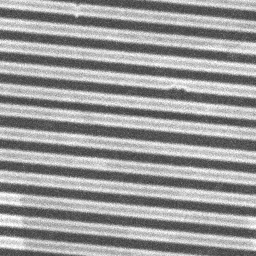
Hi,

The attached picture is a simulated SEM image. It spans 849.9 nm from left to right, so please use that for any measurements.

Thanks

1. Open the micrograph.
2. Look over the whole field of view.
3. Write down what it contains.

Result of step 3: parallel lines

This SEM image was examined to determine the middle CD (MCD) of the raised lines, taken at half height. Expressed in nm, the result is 28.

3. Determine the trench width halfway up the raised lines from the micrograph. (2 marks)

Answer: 42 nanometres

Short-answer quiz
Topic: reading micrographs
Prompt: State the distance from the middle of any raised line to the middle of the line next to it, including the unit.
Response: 21.7 px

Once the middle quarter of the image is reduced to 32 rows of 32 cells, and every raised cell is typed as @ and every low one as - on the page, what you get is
--------------------------@@@@@@
@@------------------------------
@@@@@@@@@@@@--------------------
--@@@@@@@@@@@@@@@@@@@@----------
------------@@@@@@@@@@@@@@@@@@@@
-----------------------@@@@@@@@@
--------------------------------
@@@@@@@-------------------------
@@@@@@@@@@@@@@@@@---------------
-------@@@@@@@@@@@@@@@@@@@@-----
------------------@@@@@@@@@@@@@@
----------------------------@@@@
@@@@@@--------------------------
@@@@@@@@@@@@@@@@----------------
-------@@@@@@@@@@@@@@@@@@@------
-----------------@@@@@@@@@@@@@@@
---------------------------@@@@@
--------------------------------
@@@@@@@-------------------------
@@@@@@@@@@@@@@@@@---------------
--------@@@@@@@@@@@@@@@@@@@-----
------------------@@@@@@@@@@@@@@
----------------------------@@@@
@@------------------------------
@@@@@@@@@@@@@@------------------
---@@@@@@@@@@@@@@@@@@@@---------
-------------@@@@@@@@@@@@@@@@@@@
-----------------------@@@@@@@@@
--------------------------------
@@@@@@@@@@----------------------
@@@@@@@@@@@@@@@@@@@@------------
--------@@@@@@@@@@@@@@@@@@@@@@--